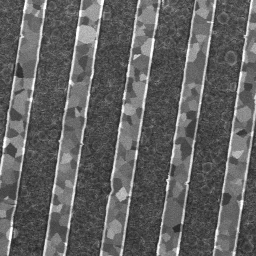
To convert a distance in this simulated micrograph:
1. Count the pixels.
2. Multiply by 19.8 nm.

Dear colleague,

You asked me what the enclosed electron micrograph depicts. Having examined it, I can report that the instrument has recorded parallel lines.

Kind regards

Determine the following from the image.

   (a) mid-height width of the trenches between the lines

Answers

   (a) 701 nm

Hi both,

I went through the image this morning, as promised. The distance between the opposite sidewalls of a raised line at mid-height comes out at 400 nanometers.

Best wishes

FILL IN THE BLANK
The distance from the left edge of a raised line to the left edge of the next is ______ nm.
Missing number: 1110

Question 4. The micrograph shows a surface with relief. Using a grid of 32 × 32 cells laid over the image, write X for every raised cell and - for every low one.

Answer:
---XXX----XXX----XXX----XXX----X
---XX-----XXX----XXX----XXX----X
---XX-----XX-----XXX----XXX----X
---XX-----XX-----XX-----XX-----X
---XX-----XX-----XX-----XX-----X
--XXX----XXX-----XX-----XX-----X
--XXX----XXX----XXX----XXX----XX
--XXX----XXX----XXX----XXX--X-XX
--XXX----XXX----XXX----XXX----XX
--XX-----XX-----XXX----XX-----XX
--XX-----XX-----XX-----XX-----XX
--XX-----XX-----XX-----XX-----XX
-XXX----XXX----XXX-----XX-----XX
-XXX----XXX----XXX----XXX----XXX
-XXX----XXX----XXX----XXX----XXX
-XX-----XXX----XXX----XXX----XXX
-XX-----XX-----XX-----XX-----XXX
-XX-----XX-----XX-----XX-----XX-
XXX----XXX-----XX-----XX-----XX-
XXX----XXX----XXX-----XX-----XX-
XXX----XXX----XXX----XXX----XXX-
XXX----XXX----XXX----XXX----XXX-
XX-----XXX----XXX----XXX----XXX-
XX-----XX-----XX-----XX-----XX--
XX-----XX-----XX-----XX-----XX--
XX----XXX-----XX-----XX-----XX--
XX----XXX----XXX----XXX----XXX--
X-----XXX----XXX----XXX----XXX--
X-----XXX----XXX----XXX----XXX--
X-----XX-----XXX----XXX----XXX--
X-----XX-----XX-----XX-----XX---
X-----XX-----XX-----XX-----XX---